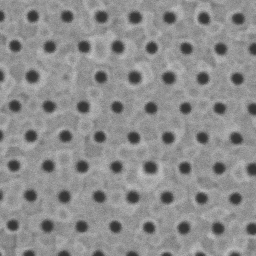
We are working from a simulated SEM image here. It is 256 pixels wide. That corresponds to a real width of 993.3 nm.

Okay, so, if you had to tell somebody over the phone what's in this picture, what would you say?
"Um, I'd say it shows a regular array of holes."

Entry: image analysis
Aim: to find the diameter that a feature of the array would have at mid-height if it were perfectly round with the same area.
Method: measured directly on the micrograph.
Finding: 47.9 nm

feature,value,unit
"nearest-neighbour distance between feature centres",132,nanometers